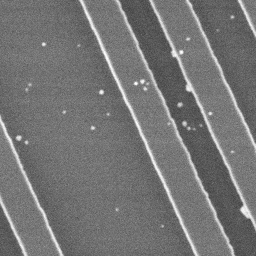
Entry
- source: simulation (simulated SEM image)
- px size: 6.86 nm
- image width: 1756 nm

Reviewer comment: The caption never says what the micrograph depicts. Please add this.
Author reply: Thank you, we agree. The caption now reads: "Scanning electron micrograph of lines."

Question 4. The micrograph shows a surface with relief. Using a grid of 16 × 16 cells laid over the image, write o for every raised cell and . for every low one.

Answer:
.....ooo..oo...o
......oo..oo....
......ooo..oo...
.......oo..oo...
.......oo..ooo..
.......ooo..oo..
........oo..ooo.
........ooo..oo.
o........oo..ooo
o........ooo..oo
o.........oo..oo
oo........ooo..o
oo.........oo..o
ooo........ooo..
.oo.........oo..
.ooo........oo..